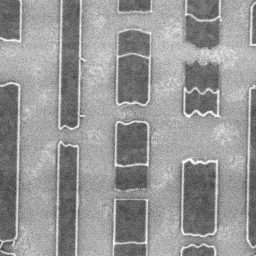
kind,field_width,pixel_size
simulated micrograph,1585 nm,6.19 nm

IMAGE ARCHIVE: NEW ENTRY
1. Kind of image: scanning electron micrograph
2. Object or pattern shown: one or a few lines or trenches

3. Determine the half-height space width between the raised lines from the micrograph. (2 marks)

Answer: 231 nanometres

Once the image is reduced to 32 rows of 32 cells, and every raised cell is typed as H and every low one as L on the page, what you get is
HHHLLLLLHHLLLLLLLLLLLLLHHHHLLLLL
HHHLLLLLHHLLLLLLLLLLLLLHHHHLLLLL
HHHLLLLLHHLLLLLLLLLLLLLLLHHLLLLL
HHHLLLLLHHLLLLLLLLLLLLLLLLLLLLLH
HHLLLLLLHHLLLLLLLLLLLLLLLLLLLLLH
LLLLLLLLHHLLLLLLLLLLLLLLLLLLLLLL
LLLLLLLLHHLLLLLLLLLLLLLLLLLLLLLL
LLLLLLLLHHLLLLLHHHHLLLLLLLLLLLLL
LLLLLLLLHHLLLLLHHHHLLLLLLLLLLLLL
LLLLLLLHHHLLLLLHHHHLLLLLLLLLLLLL
LHLLLLLHHHLLLLLHHHHLLLLLLLLLLLLL
HHLLLLLHHHLLLLLHHHHLLLLHHLHLLLLH
HHLLLLLHHHLLLLLHHHHLLLLHHHHLLLLH
HHLLLLLHHHLLLLLLLLLLLLLHHHHLLLLH
HHLLLLLHHHLLLLLLLLLLLLLLLLLLLLLH
HHLLLLLHHHLLLLLHHHLLLLLLLLLLLLLH
HHLLLLLLLLLLLLLHHHHLLLLLLLLLLLLH
HHLLLLLLLLLLLLLHHHHLLLLLLLLLLLLH
HHLLLLLHHHLLLLHHHHHLLLLLLLLLLLLH
HHLLLLLHHHLLLLHHHHLLLLLLLLLLLLLH
HHLLLLLHHHLLLLLHHHLLLLLHHHHLLLLH
HHLLLLLHHHLLLLLLLLLLLLLHHHHLLLLH
HHLLLLLHHHLLLLLLLLLLLLLHHHHLLLLH
HHLLLLLHHHLLLLLLLLLLLLLHHHHLLLLH
HHLLLLLHHHLLLLLLLLLLLLLHHHHLLLLH
HHLLLLLHHHLLLLHHHHLLLLLHHHHLLLLH
HHLLLLLHHHLLLLHHHHLLLLLHHHHLLLLH
HHLLLLLHHHLLLLHHHHLLLLLHHHHLLLLH
HHLLLLLHHHLLLLHHHHLLLLLHHHHLLLLH
HHLLLLLHHHLLLLHHHHLLLLLLLLLLLLLH
LLLLLLLHHLLLLLLLLLLLLLLLLLLLLLLH
HLLLLLLHHLLLLLLLLLLLLLLHHHHLLLLL